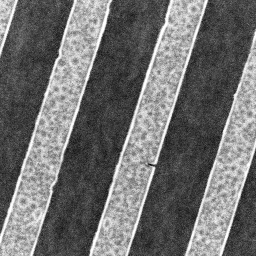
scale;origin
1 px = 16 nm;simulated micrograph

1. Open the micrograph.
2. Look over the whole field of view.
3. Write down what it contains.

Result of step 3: one or a few lines or trenches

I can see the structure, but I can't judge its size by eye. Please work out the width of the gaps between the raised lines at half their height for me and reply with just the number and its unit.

56.8 pixels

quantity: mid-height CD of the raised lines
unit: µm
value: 0.537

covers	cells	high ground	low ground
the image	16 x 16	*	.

*....**....**...
*...***...**....
....**....**....
....**....**....
...***...**....*
...**....**....*
...**....**....*
..***...***...**
..**....**....**
..**....**....**
.***...***...***
.**....**....**.
.**....**....**.
.**...***...***.
**....**....**..
**....**....**..